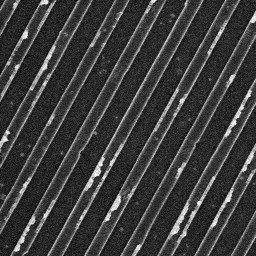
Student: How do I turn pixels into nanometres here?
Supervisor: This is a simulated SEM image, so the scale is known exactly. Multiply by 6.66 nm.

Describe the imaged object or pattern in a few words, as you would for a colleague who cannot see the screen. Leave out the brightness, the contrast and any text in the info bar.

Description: parallel lines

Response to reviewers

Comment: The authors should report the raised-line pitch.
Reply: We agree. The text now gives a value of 214 nanometers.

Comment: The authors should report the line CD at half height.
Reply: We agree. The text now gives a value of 12.9 px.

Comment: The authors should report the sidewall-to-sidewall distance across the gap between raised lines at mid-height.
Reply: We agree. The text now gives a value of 126 nm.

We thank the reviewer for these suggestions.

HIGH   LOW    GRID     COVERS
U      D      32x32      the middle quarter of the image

DDDDUUUDDDDDDUUUDDDDDDUUUUDDDDDU
DDDUUUUDDDDDUUUUDDDDDDUUUDDDDDDU
DDDUUUDDDDDDUUUDDDDDDUUUUDDDDDUU
DDUUUUDDDDDUUUUDDDDDDUUUDDDDDDUU
DDUUUDDDDDDUUUDDDDDDUUUUDDDDDUUU
DUUUDDDDDDUUUUDDDDDUUUUDDDDDUUUU
UUUUDDDDDDUUUDDDDDDUUUDDDDDDUUUU
UUUDDDDDDUUUUDDDDDUUUUDDDDDUUUUD
UUUDDDDDUUUUDDDDDDUUUDDDDDDUUUDD
UUDDDDDDUUUDDDDDDUUUUDDDDDUUUUDD
UUDDDDDUUUUDDDDDDUUUDDDDDDUUUDDD
UDDDDDDUUUDDDDDDUUUUDDDDDUUUUDDD
UDDDDDUUUUDDDDDDUUUDDDDDDUUUDDDD
DDDDDDUUUDDDDDDUUUUDDDDDUUUUDDDD
DDDDDUUUUDDDDDUUUUDDDDDDUUUDDDDD
DDDDDUUUDDDDDDUUUDDDDDDUUUUDDDDD
DDDDUUUUDDDDDUUUUDDDDDUUUUDDDDDU
DDDUUUUDDDDDDUUUDDDDDDUUUDDDDDDU
DDDUUUDDDDDDUUUUDDDDDUUUUDDDDDUU
DDUUUUDDDDDDUUUDDDDDDUUUDDDDDDUU
DDUUUDDDDDDUUUUDDDDDUUUUDDDDDUUU
DUUUUDDDDDDUUUDDDDDDUUUDDDDDDUUU
DUUUDDDDDDUUUUDDDDDUUUUDDDDDUUUU
UUUUDDDDDDUUUDDDDDDUUUDDDDDDUUUD
UUUDDDDDDUUUUDDDDDUUUUDDDDDUUUUD
UUUDDDDDUUUUDDDDDUUUUDDDDDDUUUDD
UUDDDDDDUUUDDDDDDUUUDDDDDDUUUUDD
UUDDDDDUUUUDDDDDUUUUDDDDDUUUUDDD
UDDDDDDUUUDDDDDDUUUDDDDDDUUUDDDD
DDDDDDUUUUDDDDDUUUUDDDDDUUUUDDDD
DDDDDDUUUDDDDDDUUUDDDDDDUUUDDDDD
DDDDDUUUUDDDDDUUUUDDDDDUUUUDDDDD